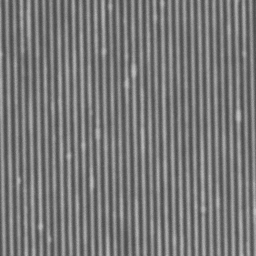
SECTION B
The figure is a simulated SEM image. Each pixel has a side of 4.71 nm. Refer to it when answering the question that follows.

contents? parallel lines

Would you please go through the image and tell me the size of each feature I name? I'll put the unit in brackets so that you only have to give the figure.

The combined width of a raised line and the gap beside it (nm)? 34.8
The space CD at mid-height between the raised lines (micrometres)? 0.0224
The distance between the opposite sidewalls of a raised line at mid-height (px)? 2.87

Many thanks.